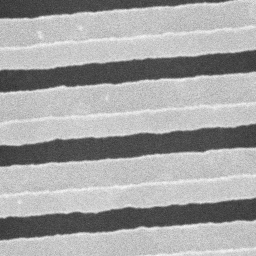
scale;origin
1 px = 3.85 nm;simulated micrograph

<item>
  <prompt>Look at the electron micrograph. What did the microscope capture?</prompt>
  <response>lines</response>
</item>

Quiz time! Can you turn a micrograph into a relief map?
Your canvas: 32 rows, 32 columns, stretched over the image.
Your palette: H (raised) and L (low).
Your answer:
LLLLLLLLLLLLLLLLLLLLLLLLHHHHHHHH
LLLLLLLLLLLLLHHHHHHHHHHHHHHHHHHH
HHHHHHHHHHHHHHHHHHHHHHHHHHHHHHHH
HHHHHHHHHHHHHHHHHHHHHHHHHHHHHHHH
HHHHHHHHHHHHHHHHHHHHHHHHHHHHHHHH
HHHHHHHHHHHHHHHHHHHHHHHHHHHHHHHH
HHHHHHHHHHHHHHHHHHHHHHHHHHHHHHLL
HHHHHHHHHHHHHHHHLLLLLLLLLLLLLLLL
HHHHHHHLLLLLLLLLLLLLLLLLLLLLLLLL
LLLLLLLLLLLLLLLLLLLLLLLLLHHHHHHH
LLLLLLLLLLLLLLLHHHHHHHHHHHHHHHHH
LLHHHHHHHHHHHHHHHHHHHHHHHHHHHHHH
HHHHHHHHHHHHHHHHHHHHHHHHHHHHHHHH
HHHHHHHHHHHHHHHHHHHHHHHHHHHHHHHH
HHHHHHHHHHHHHHHHHHHHHHHHHHHHHHHH
HHHHHHHHHHHHHHHHHHHHHHHHHHHHHHHL
HHHHHHHHHHHHHHHHHHHHHLLLLLLLLLLL
HHHHHHHLLLLLLLLLLLLLLLLLLLLLLLLL
LLLLLLLLLLLLLLLLLLLLLLLLLLLLLLLL
LLLLLLLLLLLLLLLLLLHHHHHHHHHHHHHH
LLLLLHHHHHHHHHHHHHHHHHHHHHHHHHHH
HHHHHHHHHHHHHHHHHHHHHHHHHHHHHHHH
HHHHHHHHHHHHHHHHHHHHHHHHHHHHHHHH
HHHHHHHHHHHHHHHHHHHHHHHHHHHHHHHH
HHHHHHHHHHHHHHHHHHHHHHHHHHHHHHHH
HHHHHHHHHHHHHHHHHHHHHHHLLLLLLLLL
HHHHHHHHHLHHLLLLLLLLLLLLLLLLLLLL
LLLLLLLLLLLLLLLLLLLLLLLLLLLLLLLL
LLLLLLLLLLLLLLLLLHLHHHHHHHHHHHHH
LLLLLLHHHHHHHHHHHHHHHHHHHHHHHHHH
HHHHHHHHHHHHHHHHHHHHHHHHHHHHHHHH
HHHHHHHHHHHHHHHHHHHHHHHHHHHHHHHH